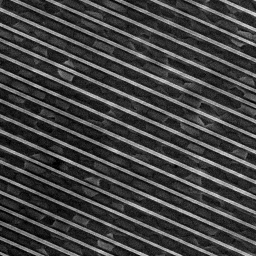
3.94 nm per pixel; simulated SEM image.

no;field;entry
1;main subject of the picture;parallel lines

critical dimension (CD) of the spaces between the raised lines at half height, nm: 43.2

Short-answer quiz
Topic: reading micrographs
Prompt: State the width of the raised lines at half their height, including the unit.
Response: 9.9 nm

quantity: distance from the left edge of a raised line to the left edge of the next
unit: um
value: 0.055